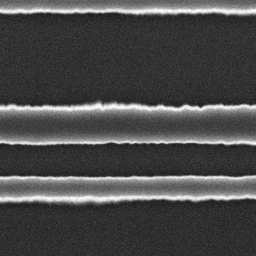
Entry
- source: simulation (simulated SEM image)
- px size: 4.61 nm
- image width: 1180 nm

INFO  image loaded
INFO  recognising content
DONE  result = lines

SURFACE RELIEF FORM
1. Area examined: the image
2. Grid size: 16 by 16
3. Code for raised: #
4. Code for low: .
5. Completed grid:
################
................
................
................
................
................
................
################
################
################
################
################
................
................
................
................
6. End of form